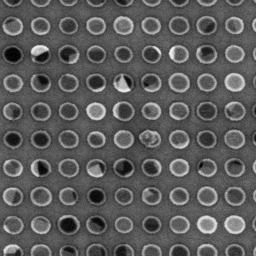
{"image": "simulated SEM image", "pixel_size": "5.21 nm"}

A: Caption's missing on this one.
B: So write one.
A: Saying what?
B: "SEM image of a regular array of raised bodies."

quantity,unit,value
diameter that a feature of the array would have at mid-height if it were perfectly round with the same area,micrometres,0.0905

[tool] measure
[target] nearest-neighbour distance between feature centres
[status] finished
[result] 144 nanometers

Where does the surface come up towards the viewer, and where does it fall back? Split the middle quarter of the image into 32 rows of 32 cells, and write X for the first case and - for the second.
--------------------------------
--------------------------------
--------------------------------
XXX---XXXX---XXXX---XXXX---XXXX-
XXX---XXXX---XXXX---XXXX--XXXXX-
XXX---XXXX---XXXX---XXXX---XXXX-
XXX----XX-----XX-----XX-----XX--
--------------------------------
--------------------------------
--------------------------------
XXX---XXXX---XXXX---XXX----XXX--
XXX---XXXX---XXXX---XXXX---XXXX-
XXX---XXXX---XXXX---XXXX---XXXX-
XX-----XX-----XXX----XX-----XX--
--------------------------------
--------------------------------
--------------------------------
XXX----XX----XXXX--XXXX----XXX--
XXX---XXXX---XXXX--XXXXX--XXXXX-
XXX---XXXX---XXXX--XXXXX---XXXX-
XXX----XX-----XX-----X------XX--
--------------------------------
--------------------------------
--------------------------------
XXX---XXXX---XXX----XXX----XXX--
XXX---XXXX---XXXX---XXXX---XXXX-
XXX---XXXX---XXXX---XXXX---XXXX-
XXX----XXX---XXXX----XX-----XX--
--------------------------------
--------------------------------
--------------------------------
XX-----XX-----XX----XXX-----XX--